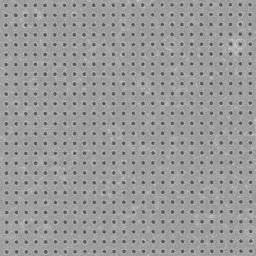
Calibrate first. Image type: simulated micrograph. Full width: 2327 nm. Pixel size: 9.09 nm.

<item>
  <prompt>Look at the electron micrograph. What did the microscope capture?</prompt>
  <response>a regular array of holes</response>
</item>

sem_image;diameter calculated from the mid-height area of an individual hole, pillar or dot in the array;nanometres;34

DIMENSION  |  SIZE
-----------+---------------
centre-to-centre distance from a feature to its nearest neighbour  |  0.0868 micrometres